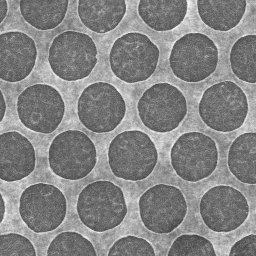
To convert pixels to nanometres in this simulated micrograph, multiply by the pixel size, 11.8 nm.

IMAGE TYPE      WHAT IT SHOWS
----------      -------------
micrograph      a regular array of holes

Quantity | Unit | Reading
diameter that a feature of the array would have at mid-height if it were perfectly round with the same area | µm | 0.582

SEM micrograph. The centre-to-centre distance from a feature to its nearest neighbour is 681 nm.